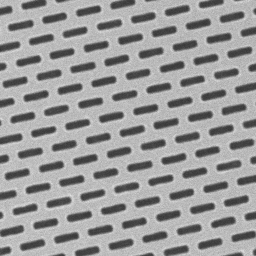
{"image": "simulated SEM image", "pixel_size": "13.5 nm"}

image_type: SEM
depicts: a regular array of holes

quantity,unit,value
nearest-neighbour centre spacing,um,0.334